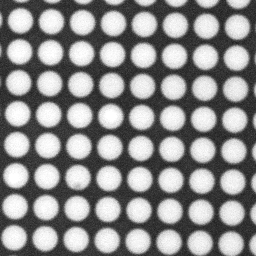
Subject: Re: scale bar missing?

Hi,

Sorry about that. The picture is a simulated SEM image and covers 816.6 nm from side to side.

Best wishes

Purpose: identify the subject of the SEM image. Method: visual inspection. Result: an array of small figures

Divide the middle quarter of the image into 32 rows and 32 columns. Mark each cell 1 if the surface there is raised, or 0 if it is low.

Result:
00000000000110000011100000111100
00000000000000000000000000000000
00011100000110000000000000000000
00111110001111000111110001111000
01111110011111100111111001111100
01111110011111100111111011111100
00111110011111100111111001111100
00111100001111000111110001111100
00000000000000000001100000111000
00000000000000000000000000000000
00111100001110000011100000000000
01111110011111000111110001111000
01111110011111100111110011111100
01111110011111100111110011111100
01111110011111000111110011111100
00111000001111000111110001111100
00000000000000000000000000010000
00000000000000000000000000000000
00111100011110000011100000110000
01111110011111000111110001111000
01111110011111101111110011111100
01111110111111101111110011111100
01111100011111001111110011111100
00011000001110000111100001111000
00000000000000000000000000000000
00010000000000000000000000000000
01111100011110000111100001110000
01111100111111001111110011111000
11111110111111001111110011111101
01111100111111001111110011111101
01111100011111001111110011111000
00000000001100000111000001111000